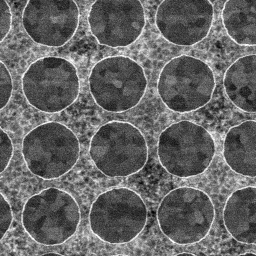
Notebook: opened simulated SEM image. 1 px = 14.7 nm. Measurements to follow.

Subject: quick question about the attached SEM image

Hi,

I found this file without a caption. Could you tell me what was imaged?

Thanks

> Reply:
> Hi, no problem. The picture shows a regular array of raised bodies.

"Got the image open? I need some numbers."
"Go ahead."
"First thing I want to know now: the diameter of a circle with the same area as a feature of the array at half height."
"57.3 px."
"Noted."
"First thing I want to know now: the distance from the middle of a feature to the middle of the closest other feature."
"974 nm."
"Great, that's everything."